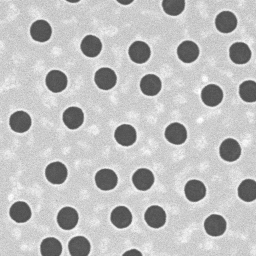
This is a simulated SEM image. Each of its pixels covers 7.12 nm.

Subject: a regular array of holes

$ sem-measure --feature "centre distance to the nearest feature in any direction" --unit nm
286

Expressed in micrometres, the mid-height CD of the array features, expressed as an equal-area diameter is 0.16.